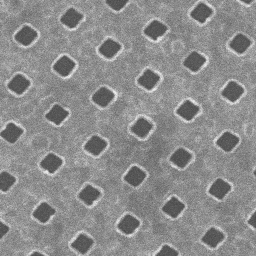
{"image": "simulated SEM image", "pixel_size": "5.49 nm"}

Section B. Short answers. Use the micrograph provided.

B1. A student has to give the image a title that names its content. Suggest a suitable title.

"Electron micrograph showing a regular array of holes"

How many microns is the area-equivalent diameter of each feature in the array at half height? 0.109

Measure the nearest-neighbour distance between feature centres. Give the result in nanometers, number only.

267